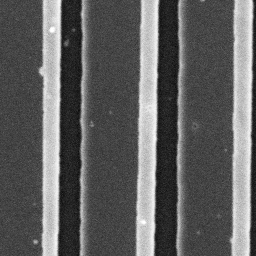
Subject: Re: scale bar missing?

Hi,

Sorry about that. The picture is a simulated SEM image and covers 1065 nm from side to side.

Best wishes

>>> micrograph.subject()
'lines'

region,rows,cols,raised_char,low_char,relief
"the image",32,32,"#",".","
########..##########..##########
########..##########..##########
########..##########..##########
########..##########..##########
########..##########..##########
#######...##########...########.
#######...##########...#########
#######...##########...########.
#######...##########...########.
#######...##########..#########.
#######...##########..#########.
#######...#########...#########.
#######...#########...#########.
#######...##########..#########.
#######...##########..#########.
#######...#########...#########.
#######...#########...#########.
#######...#########...#########.
#######...#########...#########.
#######...#########...#########.
#######...#########...#########.
#######...#########...#########.
#######...#########...#########.
#######...#########...#########.
#######...#########...#########.
#######...#########...#########.
#######...#########...#########.
#######...#########...#########.
#######...#########...#########.
#######...#########...#########.
#######...#########...#########.
#######...#########...#########.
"